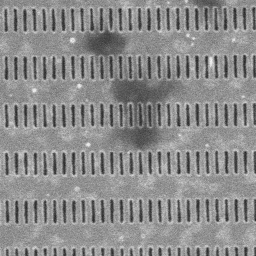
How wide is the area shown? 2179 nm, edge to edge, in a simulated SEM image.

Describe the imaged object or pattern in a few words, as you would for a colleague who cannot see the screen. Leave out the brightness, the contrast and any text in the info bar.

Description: a regular array of holes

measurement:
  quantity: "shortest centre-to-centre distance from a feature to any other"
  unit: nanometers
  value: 80.1